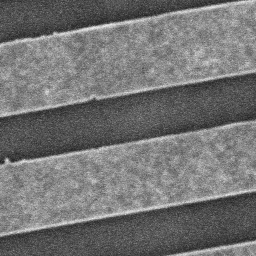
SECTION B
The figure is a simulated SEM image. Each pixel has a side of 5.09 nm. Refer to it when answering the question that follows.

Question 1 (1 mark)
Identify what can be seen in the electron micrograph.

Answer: one or a few lines or trenches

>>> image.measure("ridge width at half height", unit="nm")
352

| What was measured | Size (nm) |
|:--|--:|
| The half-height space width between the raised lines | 249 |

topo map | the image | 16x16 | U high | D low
DDDDDDDDDDDDDUUU
DDDDDDDUUUUUUUUU
DDUUUUUUUUUUUUUU
UUUUUUUUUUUUUUUU
UUUUUUUUUUUUUUUU
UUUUUUUUUUDDDDDD
UUUUDDDDDDDDDDDD
DDDDDDDDDDDDDDDD
DDDDDDDDDDDUUUUU
DDDDDUUUUUUUUUUU
UUUUUUUUUUUUUUUU
UUUUUUUUUUUUUUUU
UUUUUUUUUUUUUDDD
UUUUUUUDDDDDDDDD
UDDDDDDDDDDDDDDD
DDDDDDDDDDDDDDUU